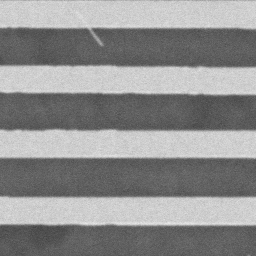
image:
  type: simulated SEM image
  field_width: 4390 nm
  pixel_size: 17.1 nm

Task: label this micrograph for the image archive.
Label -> lines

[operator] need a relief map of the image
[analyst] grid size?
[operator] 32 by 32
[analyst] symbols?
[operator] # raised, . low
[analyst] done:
################################
################################
################################
...........#....................
................................
................................
................................
................................
##########################......
################################
################################
.............###..##############
................................
................................
................................
................................
################################
################################
################################
################################
................................
................................
................................
................................
................................
################################
################################
################################
................................
................................
................................
................................